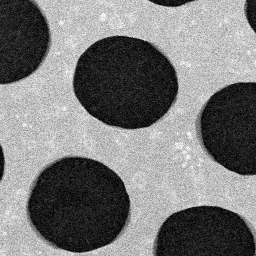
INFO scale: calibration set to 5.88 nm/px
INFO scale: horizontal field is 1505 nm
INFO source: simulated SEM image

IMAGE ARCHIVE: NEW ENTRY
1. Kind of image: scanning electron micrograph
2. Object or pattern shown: holes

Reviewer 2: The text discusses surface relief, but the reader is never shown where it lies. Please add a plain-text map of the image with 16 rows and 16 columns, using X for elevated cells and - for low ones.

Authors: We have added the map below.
--XXXXXXXXXXXXX-
---XXXXXXXXXXXXX
---XXX---XXXXXXX
---XX-----XXXXXX
--XXX------XXXXX
XXXXX------XXX--
XXXXX------XX---
XXXXXX----XX----
XXXXXXXXXXXX----
XXXXXXXXXXXXX---
XXX----XXXXXXX--
XX------XXXXXXXX
XX------XXXXXXXX
XX------XXX----X
XX------XX------
XXXX--XXXX------